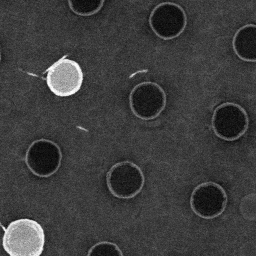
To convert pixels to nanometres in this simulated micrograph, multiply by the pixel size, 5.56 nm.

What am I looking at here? raised bodies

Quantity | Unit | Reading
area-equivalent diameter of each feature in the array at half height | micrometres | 0.197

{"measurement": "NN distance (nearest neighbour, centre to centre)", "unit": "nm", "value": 458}